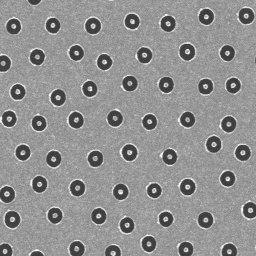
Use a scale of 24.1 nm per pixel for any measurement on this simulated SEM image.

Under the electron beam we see a regular array of ring-shaped grooves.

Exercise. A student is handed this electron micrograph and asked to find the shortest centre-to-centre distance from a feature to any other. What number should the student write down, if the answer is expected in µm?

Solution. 0.769